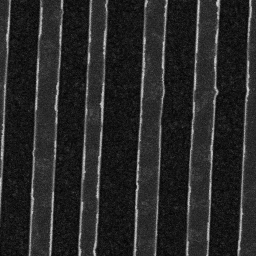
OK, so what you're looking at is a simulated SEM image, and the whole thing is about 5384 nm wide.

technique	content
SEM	parallel lines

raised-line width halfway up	457	nm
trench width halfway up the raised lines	641	nm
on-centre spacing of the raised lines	1100	nm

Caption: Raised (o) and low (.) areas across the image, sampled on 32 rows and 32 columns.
o....ooo...oo.....ooo....oo....o
o....ooo...oo.....ooo....oo....o
o....ooo...oo.....ooo....oo....o
o....ooo...oo.....ooo....oo....o
o....ooo...oo.....ooo....oo....o
o....ooo...oo.....ooo....oo....o
o....ooo...oo.....oo....ooo....o
o....oo....oo.....oo....ooo....o
o....oo....oo.....oo....ooo....o
o....oo....oo.....oo....ooo....o
o....oo....oo.....oo....ooo....o
o....oo....oo.....oo....ooo....o
o...ooo....oo.....oo....ooo....o
o...ooo....oo.....oo....ooo....o
o...ooo....oo.....oo....ooo....o
....ooo....oo.....oo....ooo....o
....ooo....oo....ooo....ooo....o
....ooo....oo....ooo....ooo....o
....ooo....oo....ooo....ooo...oo
....ooo...ooo....ooo....ooo...oo
....ooo...oo.....ooo....oo....oo
....ooo...oo.....ooo....oo....oo
....ooo...oo.....ooo....oo....oo
....ooo...oo.....ooo....oo....oo
....ooo...oo.....ooo....oo....oo
....ooo...oo.....ooo....oo....oo
....ooo...oo.....ooo....oo....oo
....ooo...oo.....ooo....oo....oo
....oo....oo.....ooo...ooo....oo
....oo....oo.....ooo...ooo....oo
....oo....oo.....oo....ooo....oo
....oo....oo.....oo....ooo....oo